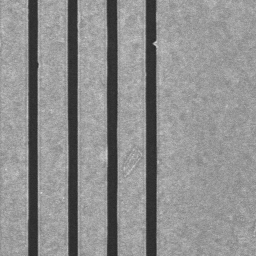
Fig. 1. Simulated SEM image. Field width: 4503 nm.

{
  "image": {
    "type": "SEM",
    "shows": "parallel lines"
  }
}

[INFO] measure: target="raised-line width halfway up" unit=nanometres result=499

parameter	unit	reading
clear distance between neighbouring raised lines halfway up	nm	189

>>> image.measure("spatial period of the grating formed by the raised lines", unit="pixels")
39.3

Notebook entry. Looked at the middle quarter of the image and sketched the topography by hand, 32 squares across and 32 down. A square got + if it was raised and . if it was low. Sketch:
+...+++++++..+++++++...+++++++++
+...+++++++..+++++++...+++++++++
+...+++++++..+++++++...+++++++++
+...+++++++...++++++...+++++++++
+...+++++++...++++++...+++++++++
+...+++++++...++++++...+++++++++
+...+++++++...++++++...+++++++++
+...+++++++...++++++...+++++++++
+...+++++++...++++++...+++++++++
+...+++++++...++++++...+++++++++
+...+++++++...++++++...+++++++++
+...+++++++...++++++...+++++++++
+...+++++++...++++++...+++++++++
+...+++++++...++++++...+++++++++
+...+++++++...++++++...+++++++++
+...+++++++...++++++...+++++++++
+...+++++++...++++++...+++++++++
+...+++++++...++++++...+++++++++
+...+++++++...++++++...+++++++++
+...+++++++...++++++...+++++++++
+...+++++++...++++++...+++++++++
+...+++++++...++++++...+++++++++
+...+++++++...++++++...+++++++++
+...+++++++...++++++...+++++++++
+...+++++++...++++++...+++++++++
+...+++++++...++++++...+++++++++
+...+++++++...++++++...+++++++++
+...+++++++...++++++...+++++++++
+...+++++++...++++++...+++++++++
+...+++++++...++++++...+++++++++
+...+++++++...++++++...+++++++++
+...+++++++...++++++...+++++++++